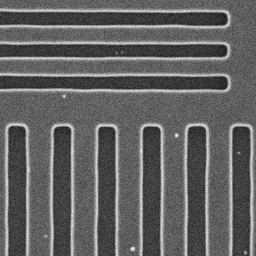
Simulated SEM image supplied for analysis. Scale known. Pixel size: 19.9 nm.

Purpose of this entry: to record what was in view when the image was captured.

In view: groups of lines, slits or small figures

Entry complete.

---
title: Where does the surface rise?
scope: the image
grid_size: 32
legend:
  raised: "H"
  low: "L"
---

HHHHHHHHHHHHHHHHHHHHHHHHHHHHHHHH
LLLLLLLLLLLLLLLLLLLLLLLLLLLLHHHH
LLLLLLLLLLLLLLLLLLLLLLLLLLLLLHHH
HHHHHHHHHHHHHHHHHHHHHHHHHHHHHHHH
HHHHHHHHHHHHHHHHHHHHHHHHHHHHHHHH
LLLLLLLLLLLLLLLLLLLLLLLLLLLLHHHH
LLLLLLLLLLLLLLLLLLLLLLLLLLLLHHHH
HHHHHHHHHHHHHHHHHHHHHHHHHHHHHHHH
HHHHHHHHHHHHHHHHHHHHHHHHHHHHHHHH
LLLLLLLLLLLLLLLLLLLLLLLLLLLLHHHH
LLLLLLLLLLLLLLLLLLLLLLLLLLLLLHHH
HHHHHHHHHHHHHHHHHHHHHHHHHHHHHHHH
HHHHHHHHHHHHHHHHHHHHHHHHHHHHHHHH
HHHHHHHHHHHHHHHHHHHHHHHHHHHHHHHH
HHHHHHHHHHHHHHHHHHHHHHHHHHHHHHHH
HHHHHHHHHHHHHHHHHHHHHHHHHHHHHHHH
HLLHHHHLLHHHLLLHHHLLHHHLLLHHHLLH
HLLHHHHLLHHHLLLHHHLLHHHLLLHHHLLH
HLLHHHHLLHHHLLLHHHLLHHHLLLHHHLLH
HLLHHHLLLHHHLLLHHHLLHHHLLLHHHLLH
HLLHHHLLLHHHLLLHHHLLHHHLLLHHHLLH
HLLHHHLLLHHHLLLHHHLLHHHLLLHHHLLH
HLLHHHLLLHHHLLLHHHLLHHHLLLHHHLLH
HLLHHHLLLHHHLLLHHHLLHHHLLLHHHLLL
HLLHHHLLLHHHLLLHHHLLHHHLLLHHHLLH
HLLHHHLLLHHHLLLHHHLLHHHLLLHHHLLH
HLLHHHLLLHHHLLLHHHLLHHHLLLHHHLLH
HLLHHHLLLHHHLLLHHHLLHHHLLLHHHLLH
HLLHHHLLLHHHLLLHHHLLHHHLLLHHHLLH
HLLHHHLLLHHHLLLHHHLLHHHLLLHHHLLH
HLLHHHLLLHHHLLLHHHLLHHHLLLHHHLLH
HLLHHHLLLHHHLLLHHHLLHHHLLLHHHLLH